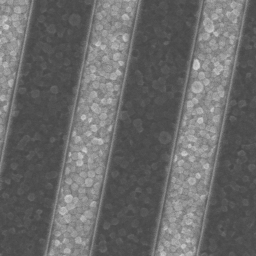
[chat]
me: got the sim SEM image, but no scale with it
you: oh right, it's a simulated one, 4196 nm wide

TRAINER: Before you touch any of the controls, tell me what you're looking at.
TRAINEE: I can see one or a few lines or trenches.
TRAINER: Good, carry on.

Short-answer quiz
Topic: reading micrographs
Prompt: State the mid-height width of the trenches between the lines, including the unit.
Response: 714 nm